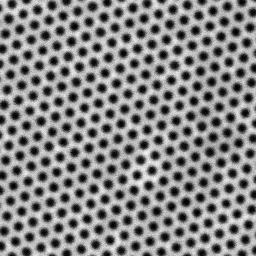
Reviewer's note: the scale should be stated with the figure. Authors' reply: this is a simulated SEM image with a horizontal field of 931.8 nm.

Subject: a regular array of holes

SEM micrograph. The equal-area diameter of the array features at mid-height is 0.0369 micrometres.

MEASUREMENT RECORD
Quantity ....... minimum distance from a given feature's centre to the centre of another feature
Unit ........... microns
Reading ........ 0.0546